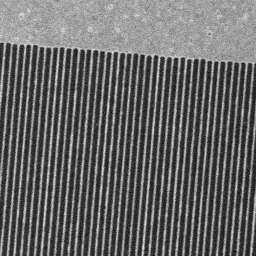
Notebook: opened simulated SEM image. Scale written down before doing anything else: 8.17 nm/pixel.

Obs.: parallel lines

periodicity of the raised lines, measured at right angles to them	55	nanometres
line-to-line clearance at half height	43.7	nanometers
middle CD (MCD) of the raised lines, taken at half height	12.2	nanometres